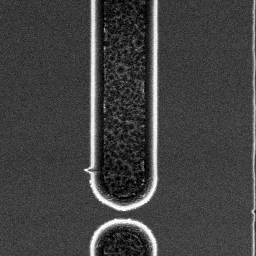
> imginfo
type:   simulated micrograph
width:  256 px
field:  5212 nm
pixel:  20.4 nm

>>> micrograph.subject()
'one or a few lines or trenches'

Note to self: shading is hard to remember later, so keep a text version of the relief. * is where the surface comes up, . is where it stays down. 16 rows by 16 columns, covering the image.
******....******
******....******
******....******
******....******
******....******
******....******
******....******
******....******
******....******
******....******
******....******
******....******
*******..*******
****************
******...*******
******....******